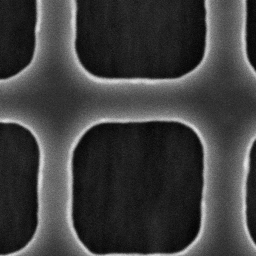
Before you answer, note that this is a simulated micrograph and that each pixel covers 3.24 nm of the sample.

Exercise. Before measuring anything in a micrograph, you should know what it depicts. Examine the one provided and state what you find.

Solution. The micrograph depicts holes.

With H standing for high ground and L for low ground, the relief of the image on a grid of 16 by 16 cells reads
LLHHHLLLLLLLLHHL
LLHHHLLLLLLLLHHL
LLHHHLLLLLLLLHHL
LLHHHLLLLLLLLHHL
LHHHHHLLLLLLHHHH
HHHHHHHHHHHHHHHH
HHHHHHHHHHHHHHHH
HHHHHHHHHHHHHHHH
LLHHHLLLLLLLHHHH
LLHHHLLLLLLLLHHH
LLHHHLLLLLLLLHHH
LLHHHLLLLLLLLHHL
LLHHLLLLLLLLLHHL
LLHHLLLLLLLLLHHL
LLHHHLLLLLLLHHHH
LHHHHLLLLLLLHHHH